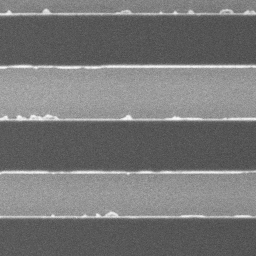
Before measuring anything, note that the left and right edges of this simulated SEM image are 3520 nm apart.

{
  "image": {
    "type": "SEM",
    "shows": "lines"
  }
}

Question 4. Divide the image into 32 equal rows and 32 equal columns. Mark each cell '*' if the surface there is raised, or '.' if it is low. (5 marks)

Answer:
................................
................................
********************************
********************************
********************************
********************************
********************************
********************************
................................
................................
................................
................................
................................
................................
................................
********************************
********************************
********************************
********************************
********************************
********************************
******************************..
................................
................................
................................
................................
................................
********************************
********************************
********************************
********************************
********************************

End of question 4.